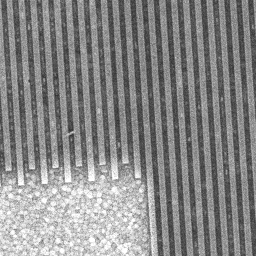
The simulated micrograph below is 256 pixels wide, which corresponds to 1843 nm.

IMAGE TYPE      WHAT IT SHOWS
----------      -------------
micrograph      parallel lines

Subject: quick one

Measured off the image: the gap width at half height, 5.86 px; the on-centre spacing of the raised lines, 84.7 nanometers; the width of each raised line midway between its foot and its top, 42.2 nm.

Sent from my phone